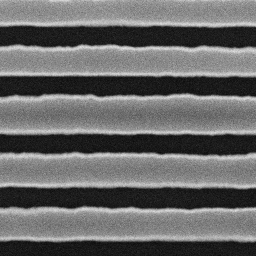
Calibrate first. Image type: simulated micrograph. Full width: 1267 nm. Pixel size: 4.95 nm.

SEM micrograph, lines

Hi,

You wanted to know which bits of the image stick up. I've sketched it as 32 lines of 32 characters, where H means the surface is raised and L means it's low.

HHHHHHHHHHHHHHHHHHHHHHHHHHHHHHHH
HHHHHHHHHHHHHHHHHHHHHHHHHHHHHHHH
HHHHHHHHHHHHHHHHHHHHHHHHHHHHHHHH
LLLLLLLLLLLLLLLLLLLLLLLLLLLLLLLL
LLLLLLLLLLLLLLLLLLLLLLLLLLLLLLLL
LLLLLLLLLLLLLLLLLLLLLLLLLLLLLLLL
HHHHHHHHHHHHHHHHHHHHHHHHHHHHHHHH
HHHHHHHHHHHHHHHHHHHHHHHHHHHHHHHH
HHHHHHHHHHHHHHHHHHHHHHHHHHHHHHHH
LLLLLLLLLLLLLLLLLLLLLLLLLLLHHLLL
LLLLLLLLLLLLLLLLLLLLLLLLLLLLLLLL
LLLLLLLLLLLLLLLLLLLLLLLLLLLLLLLL
HHHHHHHHHHHHHHHHHHHHHHHHHHHHHHHH
HHHHHHHHHHHHHHHHHHHHHHHHHHHHHHHH
HHHHHHHHHHHHHHHHHHHHHHHHHHHHHHHH
HHHHHHHHHHHHHHHHHHHHHHHHHHHHHHHH
HHHHHHHHHHHHHHHHHHHHHHHHHHHHHHHH
LLLLLLLLLLLLLLLLLLLLLLLLLLLLLLLL
LLLLLLLLLLLLLLLLLLLLLLLLLLLLLLLL
HHHHHHHHHHHHHHHHHHHHHHHHHHHHHHHH
HHHHHHHHHHHHHHHHHHHHHHHHHHHHHHHH
HHHHHHHHHHHHHHHHHHHHHHHHHHHHHHHH
HHHHHHHHHHHHHHHHHHHHHHHHHHHHHHHH
LLLLLLLLLLLLLLLLLLLLLLLLLLLLLLHL
LLLLLLLLLLLLLLLLLLLLLLLLLLLLLLLL
LLLLLLLLLLLLLLLLLLLLLLLLLLLLLLLL
HHHHHHHHHHHHHHHHHHHHHHHHHHHHHHHH
HHHHHHHHHHHHHHHHHHHHHHHHHHHHHHHH
HHHHHHHHHHHHHHHHHHHHHHHHHHHHHHHH
HHHHHHHHHHHHHHHHHHHHHHHHHHHHHHHH
LLLLLLLLLLLLLLLLLLLLLLLLLLLLLLLL
LLLLLLLLLLLLLLLLLLLLLLLLLLLLLLLL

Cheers